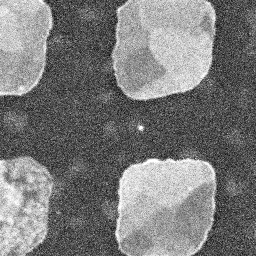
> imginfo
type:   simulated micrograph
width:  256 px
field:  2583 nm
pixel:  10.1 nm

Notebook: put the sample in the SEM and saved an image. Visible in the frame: raised bodies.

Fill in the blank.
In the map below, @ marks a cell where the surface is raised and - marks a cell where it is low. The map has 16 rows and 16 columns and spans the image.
@@@-----@@@@@---
@@@----@@@@@@---
@@@----@@@@@@---
@@@----@@@@@@---
@@@----@@@@@@---
@@------@@@@----
----------------
----------------
----------------
----------------
--------@@@@@---
--------@@@@@---
-------@@@@@@---
-------@@@@@@---
-------@@@@@@---
--------@@@@----